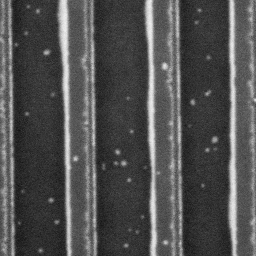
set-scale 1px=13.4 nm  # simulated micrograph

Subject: lines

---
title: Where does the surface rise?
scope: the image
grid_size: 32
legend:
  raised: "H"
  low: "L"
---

HLLLLLLLHHHHLLLLLLLHHHLLLLLLLHHH
HLLLLLLLHHHHLLLLLLLHHHLLLLLLLHHH
HLLLLLLLHHHHLLLLLLLHHHLLLLLLLHHH
HLLLLLLLHHHHLLLLLLLHHHLLLLLLLHHH
HLLLLLLLHHHHLLLLLLLHHHLLLLLLLHHH
HLLLLLLLHHHHLLLLLLLHHHLLLLLLLHHH
HLLLLLLLHHHHLLLLLLLHHHLLLLLLLHHH
HLLLLLLLHHHHLLLLLLLHHHLLLLLLLHHH
HLLLLLLLHHHHLLLLLLLHHHLLLLLLLHHH
HLLLLLLLHHHHLLLLLLLHHHLLLLLLLHHH
HLLLLLLLHHHHLLLLLLLHHHLLLLLLLHHH
HLLLLLLLHHHHLLLLLLLHHHLLLLLLLHHH
HLLLLLLLHHHHLLLLLLLHHHLLLLLLLHHH
HLLLLLLLHHHHLLLLLLLHHHLLLLLLLHHH
HLLLLLLLHHHHLLLLLLLHHHLLLLLLLHHH
HLLLLLLLHHHHLLLLLLLHHHLLLLLLLHHH
HLLLLLLLHHHHLLLLLLLHHHLLLLLLLHHH
HLLLLLLLLHHHLLLLLLLHHHLLLLLLLHHH
HLLLLLLLLHHHLLLLLLLHHHLLLLLLLHHH
HLLLLLLLLHHHLLLLLLLHHHLLLLLLLHHH
HLLLLLLLLHHHLLLLLLLHHHLLLLLLLHHH
HLLLLLLLLHHHLLLLLLLHHHLLLLLLLHHH
HHLLLLLLLHHHLLLLLLLHHHLLLLLLLHHH
HHLLLLLLLHHHLLLLLLLHHHLLLLLLLHHH
HHLLLLLLLHHHLLLLLLLHHHLLLLLLLHHH
HHLLLLLLLHHHLLLLLLLHHHHLLLLLLHHH
HHLLLLLLLHHHLLLLLLLHHHHLLLLLLHHH
HHLLLLLLLHHHLLLLLLLHHHHLLLLLLHHH
HHLLLLLLLHHHLLLLLLLHHHHLLLLLLHHH
HHLLLLLLLHHHLLLLLLLHHHHLLLLLLHHH
HHLLLLLLLHHHLLLLLLLHHHHLLLLLLHHH
HHLLLLLLLHHHLLLLLLLHHHHLLLLLLHHH